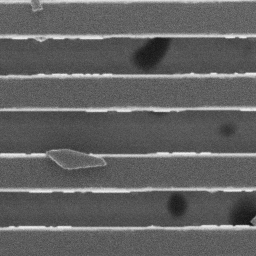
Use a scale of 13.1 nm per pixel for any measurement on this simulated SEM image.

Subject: lines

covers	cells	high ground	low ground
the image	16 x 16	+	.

++++++++++++++++
++++++++++++++++
................
................
................
++++++++++++++++
++++++++++++++++
................
................
...++...........
++++++++++++++++
++++++++++++++++
................
................
++++++++++++++++
++++++++++++++++